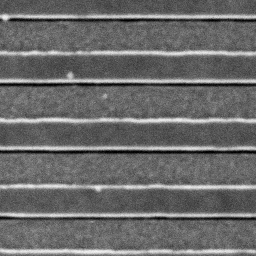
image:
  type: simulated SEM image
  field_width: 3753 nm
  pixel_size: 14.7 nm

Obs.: lines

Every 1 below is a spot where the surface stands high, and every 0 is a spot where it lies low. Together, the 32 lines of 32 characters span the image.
11111111111111111111111111111111
11111111111111111111111111111111
00000000000000000000000000000000
00000000000000000000000000000000
00000000000000000000000000000000
00000000000000000000000000000000
00000000000000000000000000000000
11111111111111111111111111111111
11111111111111111111111111111111
11111111111111111111111111111111
00000000000000000000000000000000
00000000000000000000000000000000
00000000000000000000000000000000
00000000000000000000000000000000
00000000000000000000000000000000
11111111111111111111111111111111
11111111111111111111111111111111
11111111111111111111111111111111
11111111111111111111111111111111
00000000000000000000000000000000
00000000000000000000000000000000
00000000000000000000000000000000
00000000000000000000000000000000
11111111111111111111111111111111
11111111111111111111111111111111
11111111111111111111111111111111
11111111111111111111111111111111
00000000000000000000000000000000
00000000000000000000000000000000
00000000000000000000000000000000
00000000000000000000000000000000
11111111111111111111111111111111